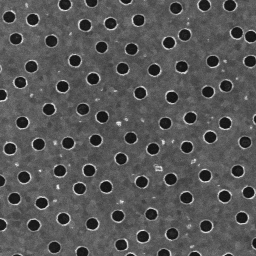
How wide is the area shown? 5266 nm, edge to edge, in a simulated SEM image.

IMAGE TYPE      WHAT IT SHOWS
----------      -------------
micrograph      a regular array of holes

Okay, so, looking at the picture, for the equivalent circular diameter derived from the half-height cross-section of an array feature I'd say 244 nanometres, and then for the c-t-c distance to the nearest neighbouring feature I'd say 518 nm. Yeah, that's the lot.